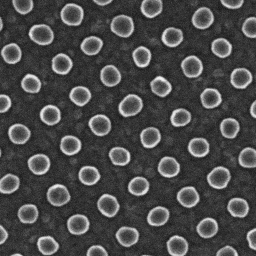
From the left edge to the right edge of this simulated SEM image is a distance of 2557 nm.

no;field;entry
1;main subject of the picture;a regular array of raised bodies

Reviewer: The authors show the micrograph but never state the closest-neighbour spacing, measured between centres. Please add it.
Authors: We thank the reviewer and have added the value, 354 nanometres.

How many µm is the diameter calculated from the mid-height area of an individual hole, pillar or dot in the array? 0.194